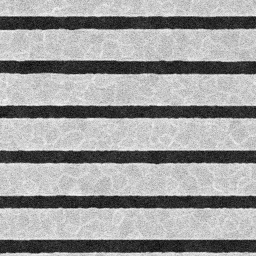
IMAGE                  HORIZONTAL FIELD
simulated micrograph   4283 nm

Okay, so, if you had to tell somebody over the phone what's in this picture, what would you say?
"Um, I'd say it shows lines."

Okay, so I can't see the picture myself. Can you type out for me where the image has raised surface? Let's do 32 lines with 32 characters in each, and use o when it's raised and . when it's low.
oooooooooooooooooooooooooooooooo
oooooooooooooooooooooooooooooooo
................................
................................
oooooooooooooooooooooooooooooooo
oooooooooooooooooooooooooooooooo
oooooooooooooooooooooooooooooooo
............................o...
................................
oooooooooooooooooooooooooooooooo
oooooooooooooooooooooooooooooooo
oooooooooooooooooooooooooooooooo
oooooooooooooooooooooooooooooooo
................................
................................
oooooooooooooooooooooooooooooooo
oooooooooooooooooooooooooooooooo
oooooooooooooooooooooooooooooooo
oooooooooooooooooooooooooooooooo
................................
................................
oooooooooooooooooooooooooooooooo
oooooooooooooooooooooooooooooooo
oooooooooooooooooooooooooooooooo
................................
................................
oooooooooooooooooooooooooooooooo
oooooooooooooooooooooooooooooooo
oooooooooooooooooooooooooooooooo
oooooooooooooooooooooooooooooooo
................................
................................